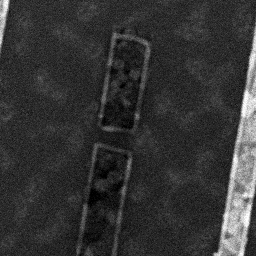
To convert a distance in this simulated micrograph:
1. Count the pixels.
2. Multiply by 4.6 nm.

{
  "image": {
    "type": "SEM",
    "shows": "one or a few lines or trenches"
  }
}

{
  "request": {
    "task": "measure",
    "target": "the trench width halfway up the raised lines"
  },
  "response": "479 nm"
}